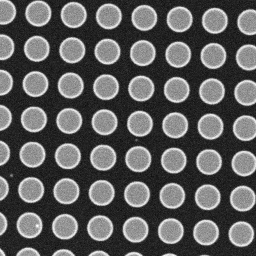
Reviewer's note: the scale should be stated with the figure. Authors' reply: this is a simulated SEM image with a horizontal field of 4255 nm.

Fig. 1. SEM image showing an array of small figures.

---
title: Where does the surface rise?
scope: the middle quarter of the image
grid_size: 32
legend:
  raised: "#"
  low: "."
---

...........................###..
................................
###.............................
####....#####.....###......##...
#####...#####....#####....#####.
#####..#######..######...######.
#####...######..######...######.
####....#####....#####...######.
.........###.....####.....#####.
...........................##...
................................
###......##.....................
####....####.....####.....###...
####...######...######...#####..
####...######...######...######.
####...######...######...######.
###.....#####...######...######.
.........##......####.....####..
................................
................................
###......##.....................
####...#####....#####.....###...
####...######...#####....#####..
####...######..#######..######..
####...######..#######..######..
###....#####....#####....#####..
.................###.....####...
................................
................................
###.....###.....................
####...#####....#####....####...
####..#######..######...######..